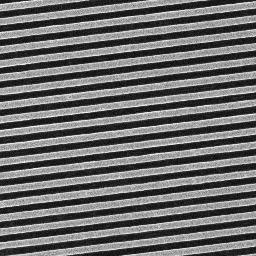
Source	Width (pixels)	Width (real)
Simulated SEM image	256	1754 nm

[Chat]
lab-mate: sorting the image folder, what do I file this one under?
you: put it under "parallel lines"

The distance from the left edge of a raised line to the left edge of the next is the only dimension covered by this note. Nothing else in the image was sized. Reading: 0.0953 µm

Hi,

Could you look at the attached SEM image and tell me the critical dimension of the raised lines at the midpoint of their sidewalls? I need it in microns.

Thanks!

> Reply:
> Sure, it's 0.0519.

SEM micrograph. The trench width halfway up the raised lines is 39.9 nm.